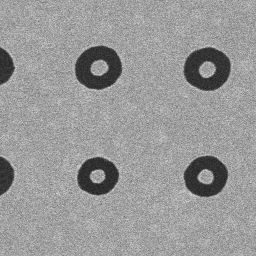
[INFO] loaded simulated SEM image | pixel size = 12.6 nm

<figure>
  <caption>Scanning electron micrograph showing ring-shaped grooves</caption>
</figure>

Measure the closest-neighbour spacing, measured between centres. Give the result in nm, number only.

1360